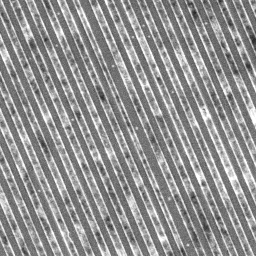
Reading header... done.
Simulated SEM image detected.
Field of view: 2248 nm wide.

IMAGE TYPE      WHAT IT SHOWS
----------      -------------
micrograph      parallel lines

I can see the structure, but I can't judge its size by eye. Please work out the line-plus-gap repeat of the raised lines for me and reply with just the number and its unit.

0.129 micrometres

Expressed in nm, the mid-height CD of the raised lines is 63.6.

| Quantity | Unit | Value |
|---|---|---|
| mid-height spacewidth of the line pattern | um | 0.0636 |